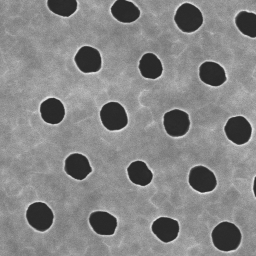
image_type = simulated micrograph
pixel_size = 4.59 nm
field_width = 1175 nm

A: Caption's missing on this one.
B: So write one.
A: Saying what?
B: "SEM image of a regular array of holes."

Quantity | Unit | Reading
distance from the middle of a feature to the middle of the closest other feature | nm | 281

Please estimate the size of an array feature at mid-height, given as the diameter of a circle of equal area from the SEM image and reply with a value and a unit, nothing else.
0.121 µm